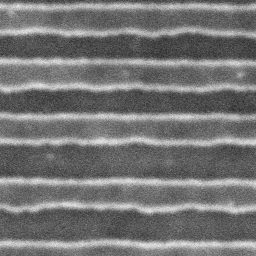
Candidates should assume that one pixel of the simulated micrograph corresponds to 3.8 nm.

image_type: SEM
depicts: lines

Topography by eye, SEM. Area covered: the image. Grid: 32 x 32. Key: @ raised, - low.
--------------------------------
@@@@@@@@@@@@@@@@@@@@@@@@@@@@@@@@
@@@@@@@@@@@@@@@@@@@@@@@@@@@@@@@@
@@@@@@@@@@@@@@@@@@@@@@@@@@@@@@@@
-------------------------------@
--------------------------------
--------------------------------
@@@-@--@--@---------------------
@@@@@@@@@@@@@@@@@@@@@@@@@@@@@@@@
@@@@@@@@@@@@@@@@@@@@@@@@@@@@@@@@
@@@@@@@@@@@@@@@@@@@@@@@@@@@@@@@@
--------------------------------
--------------------------------
--------------------------------
@@@@@-@@@@@@@@@@@@@@@@@@@@@@@@-@
@@@@@@@@@@@@@@@@@@@@@@@@@@@@@@@@
@@@@@@@@@@@@@@@@@@@@@@@@@@@@@@@@
@@@@@@@@@@@@@@@@@@@@@@@@@@@@@@@@
--------------------------------
--------------------------------
--------------------------------
--------------------------------
@@@-@---------@@@---------------
@@@@@@@@@@@@@@@@@@@@@@@@@@@@@@@@
@@@@@@@@@@@@@@@@@@@@@@@@@@@@@@@@
@@@@@@@@@@@@@@@@@@@@@@@@@@@@@@@@
------------------@----------@--
--------------------------------
--------------------------------
--------------------------------
@@@@@@@@@@@@@@@@@@@@@@@@@@@@@@@@
@@@@@@@@@@@@@@@@@@@@@@@@@@@@@@@@